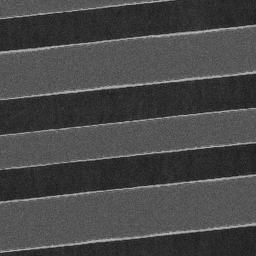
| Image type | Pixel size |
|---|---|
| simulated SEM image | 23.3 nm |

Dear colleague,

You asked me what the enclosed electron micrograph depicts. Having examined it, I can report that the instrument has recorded lines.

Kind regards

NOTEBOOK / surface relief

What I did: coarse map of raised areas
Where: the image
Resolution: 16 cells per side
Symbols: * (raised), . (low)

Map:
******..........
................
.......*********
****************
****************
*******.........
................
.........*******
****************
***********.....
*...............
...........*****
.***************
****************
************....
***.............